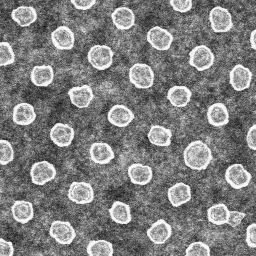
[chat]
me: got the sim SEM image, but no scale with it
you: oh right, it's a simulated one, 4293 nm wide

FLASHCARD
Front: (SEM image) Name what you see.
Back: a regular array of raised bodies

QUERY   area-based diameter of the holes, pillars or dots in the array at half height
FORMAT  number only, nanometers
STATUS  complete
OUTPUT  352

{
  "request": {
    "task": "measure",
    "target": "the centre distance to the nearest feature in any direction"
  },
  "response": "714 nm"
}